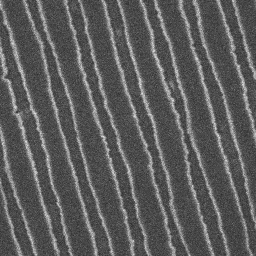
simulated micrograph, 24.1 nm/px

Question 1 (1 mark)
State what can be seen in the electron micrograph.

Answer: parallel lines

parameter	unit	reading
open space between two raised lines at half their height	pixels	13.4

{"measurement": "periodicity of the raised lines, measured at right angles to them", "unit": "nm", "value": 899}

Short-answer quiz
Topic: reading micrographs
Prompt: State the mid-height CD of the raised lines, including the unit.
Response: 0.592 microns